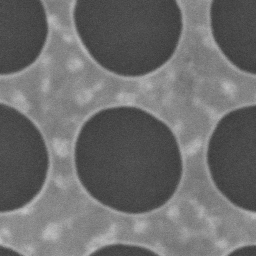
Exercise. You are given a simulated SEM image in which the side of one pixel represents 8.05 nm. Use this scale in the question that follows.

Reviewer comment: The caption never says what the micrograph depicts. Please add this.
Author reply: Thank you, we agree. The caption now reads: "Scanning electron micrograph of holes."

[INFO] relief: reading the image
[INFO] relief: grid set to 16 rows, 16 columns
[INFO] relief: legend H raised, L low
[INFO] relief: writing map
LLLHHLLLLLLHHLLL
LLLHHLLLLLLHHLLL
LLLHHLLLLLLHHLLL
LLHHHHLLLLLHHHLL
LHHHHHHLLLHHHHHL
HHHHHHHHHHHHHHHH
HHHHHHHHHHHHHHHH
LLHHHLLLLLHHHHLL
LLLHHLLLLLLHHLLL
LLLHHLLLLLLHHLLL
LLLHHLLLLLLHHLLL
LLLHHLLLLLLHHLLL
LLHHHHLLLLLHHHLL
HHHHHHHHHHHHHHHH
HHHHHHHHHHHHHHHH
LHHHHHLLLHHHHHHL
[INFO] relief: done